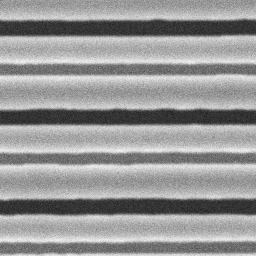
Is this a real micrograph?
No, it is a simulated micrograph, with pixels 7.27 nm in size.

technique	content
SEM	lines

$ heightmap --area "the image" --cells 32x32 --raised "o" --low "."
oooooooooooooooooooooooooooooooo
oooooooooooooooooooooooooooooooo
..o.....o.......................
................................
................................
oooooooooooooooooooooooooooooooo
oooooooooooooooooooooooooooooooo
oooooooooooooooooooooooooooooooo
oooooooooooooooooooooooooooooooo
oooooooooooooooooooooooooooooooo
oooooooooooooooooooooooooooooooo
oooooooooooooooooooooooooooooooo
oooooooooooooooooooooooooooooooo
oooo....oooooo..oooo..oo..oooooo
................................
................................
oooooooooooooooooooooooooooooooo
oooooooooooooooooooooooooooooooo
oooooooooooooooooooooooooooooooo
oooooooooooooooooooooooooooooooo
oooooooooooooooooooooooooooooooo
oooooooooooooooooooooooooooooooo
oooooooooooooooooooooooooooooooo
oooooooooooooooooooooooooooooooo
oooooooooooooooooooooooooooooooo
................................
................................
oooooooooooooooooooooooooooooooo
oooooooooooooooooooooooooooooooo
oooooooooooooooooooooooooooooooo
oooooooooooooooooooooooooooooooo
oooooooooooooooooooooooooooooooo